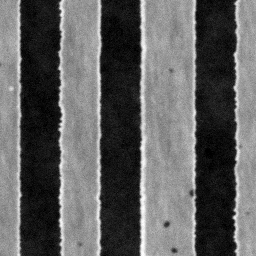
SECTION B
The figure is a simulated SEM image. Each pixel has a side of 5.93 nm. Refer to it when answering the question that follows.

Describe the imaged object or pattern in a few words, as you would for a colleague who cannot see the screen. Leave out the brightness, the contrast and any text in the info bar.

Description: lines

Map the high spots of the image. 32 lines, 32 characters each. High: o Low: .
oo......ooooo.....oooooo......oo
oo......ooooo.....oooooo......oo
oo......ooooo.....oooooo......oo
oo......ooooo.....oooooo......oo
oo......ooooo.....oooooo......oo
oo......ooooo.....oooooo......oo
oo.....oooooo.....oooooo.....ooo
ooo.....oooo......oooooo.....ooo
oo.....ooooo......oooooo......oo
oo......ooooo.....oooooo......oo
oo......ooooo.....oooooo.....ooo
oo......ooooo.....oooooo......oo
oo.....oooooo.....oooooo......oo
oo......ooooo.....oooooo......oo
ooo.....ooooo.....oooooo......oo
oo......ooooo.....oooooo......oo
oo......ooooo.....oooooo......oo
oo.....oooooo.....oooooo......oo
oo......oooo......oooooo......oo
oo......ooooo.....oooooo......oo
oo......ooooo.....oooooo......oo
oo......ooooo.....oooooo.....ooo
oo......oooo......oooooo......oo
oo......ooooo.....oooooo......oo
ooo.....oooo......oooooo......oo
oo......ooooo.....oooooo......oo
oo......oooo......oooooo.....ooo
oo......ooooo.....oooooo.....ooo
oo......ooooo.....oooooo.....ooo
oo......ooooo.....oooooo.....ooo
oo......ooooo.....oooooo......oo
oo......ooooo.....oooooo......oo